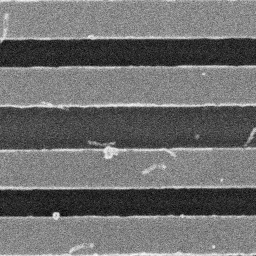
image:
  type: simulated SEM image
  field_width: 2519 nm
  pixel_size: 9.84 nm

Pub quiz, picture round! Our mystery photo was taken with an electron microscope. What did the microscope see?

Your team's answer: lines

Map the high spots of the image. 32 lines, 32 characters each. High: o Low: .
oooooooooooooooooooooooooooooooo
oooooooooooooooooooooooooooooooo
oooooooooooooooooooooooooooooooo
oooooooooooooooooooooooooooooooo
oooooooooooooooooooooooooooooooo
................................
................................
................................
....oo.ooooooooooooooooooooooooo
oooooooooooooooooooooooooooooooo
oooooooooooooooooooooooooooooooo
oooooooooooooooooooooooooooooooo
oooooooooooooooooooooooooooooooo
................................
................................
................................
................................
................................
.............o.................o
oooooooooooooooooooooooooooooooo
oooooooooooooooooooooooooooooooo
oooooooooooooooooooooooooooooooo
oooooooooooooooooooooooooooooooo
oooooooooooooooooooo............
................................
................................
................................
oooooooooooooooooooooooooooooooo
oooooooooooooooooooooooooooooooo
oooooooooooooooooooooooooooooooo
oooooooooooooooooooooooooooooooo
oooooooooooooooooooooooooooooooo